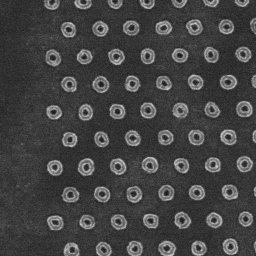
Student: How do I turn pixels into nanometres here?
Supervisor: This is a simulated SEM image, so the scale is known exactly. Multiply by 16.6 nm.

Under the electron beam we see a regular array of ring-shaped raised bodies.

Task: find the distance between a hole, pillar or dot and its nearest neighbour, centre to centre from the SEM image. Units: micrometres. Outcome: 0.514